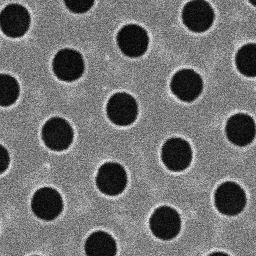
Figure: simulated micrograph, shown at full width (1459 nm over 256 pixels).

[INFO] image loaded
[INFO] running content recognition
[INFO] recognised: a regular array of holes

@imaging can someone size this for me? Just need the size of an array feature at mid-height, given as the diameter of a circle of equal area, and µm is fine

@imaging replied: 0.19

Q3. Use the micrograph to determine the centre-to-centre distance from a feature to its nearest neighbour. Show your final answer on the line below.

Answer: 394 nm